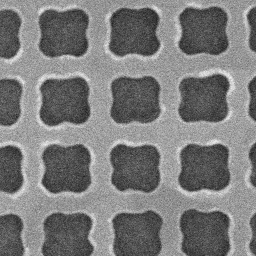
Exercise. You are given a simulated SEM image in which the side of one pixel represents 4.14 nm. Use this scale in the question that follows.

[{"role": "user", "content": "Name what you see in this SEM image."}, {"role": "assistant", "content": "a regular array of holes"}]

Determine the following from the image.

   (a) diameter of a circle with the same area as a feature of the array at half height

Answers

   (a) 53.7 pixels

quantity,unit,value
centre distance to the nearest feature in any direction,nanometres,281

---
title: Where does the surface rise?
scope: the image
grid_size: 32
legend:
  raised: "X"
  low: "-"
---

XXXXXXXXXXXXXXXXXXXXXXXXXXXXXXXX
--XXX------XXX------XXX-----XXX-
---XX------XXX------XX-------XX-
---XX------XXX------XXX-----XXX-
--XXX------XXX------XXX-----XXX-
---XX------XXX------XX-------XX-
--XXX------XXX------XXX-----XXXX
XXXXXXXXXXXXXXXXXXXXXXXXXXXXXXXX
XXXXXXXXXXXXXXXXXXXXXXXXXXXXXXXX
XXXXXXXXXXXXXXX-XX-XXXX--X--XXXX
---XX------XXX------XXX------XX-
---XX------XXX------XX------XXX-
---XX------XXX------XX------XXX-
---XX------XXX------XX-------XX-
---XX------XXX------XX------XXX-
--XXXX--X-XXXXX-XXXXXXXXXXXXXXXX
XXXXXXXXXXXXXXXXXXXXXXXXXXXXXXXX
XXXXXXXXXXXXXXXXXXXXXXXXXXXXXXXX
--XXXX-----XXX------XXX-----XXX-
---XX------XXX------XX-------XX-
---XX------XXX------XXX------XX-
---XX------XXX------XX-------XX-
---XX------XXX------XX-------XX-
---XXX-----XXX------XXX-----XXXX
XXXXXXXXXXXXXXXXXXXXXXXXXXXXXXXX
XXXXXXXXXXXXXXXXXXXXXXXXXXXXXXXX
XXXXXXXXXXXXXXXXXX--XXX-----XXXX
---XXX------XX------XXX------XX-
---XX------XXX------XX-------XX-
---XX------XXX------XXX------XX-
---XX------XXX------XXX------XX-
---XX-------XX------XXX------XX-